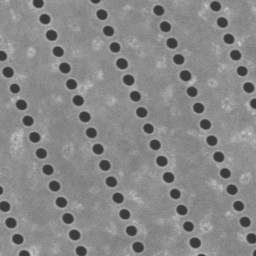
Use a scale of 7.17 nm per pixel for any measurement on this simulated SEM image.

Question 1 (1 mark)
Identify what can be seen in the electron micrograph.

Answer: a regular array of holes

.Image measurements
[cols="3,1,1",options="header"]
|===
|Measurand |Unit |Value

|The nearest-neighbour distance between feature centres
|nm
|126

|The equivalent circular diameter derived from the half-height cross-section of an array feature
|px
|10.8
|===